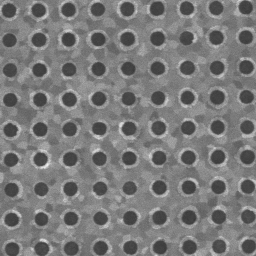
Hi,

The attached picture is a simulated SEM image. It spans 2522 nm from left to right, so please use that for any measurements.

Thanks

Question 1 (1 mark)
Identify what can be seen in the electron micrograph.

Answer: a regular array of holes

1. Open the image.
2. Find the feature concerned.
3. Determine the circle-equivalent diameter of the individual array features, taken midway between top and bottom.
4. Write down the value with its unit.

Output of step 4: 142 nanometers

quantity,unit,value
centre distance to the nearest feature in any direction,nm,290